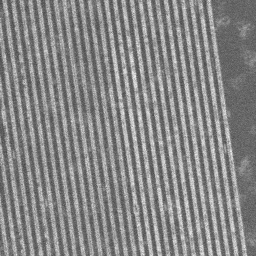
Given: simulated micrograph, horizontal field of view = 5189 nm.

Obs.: parallel lines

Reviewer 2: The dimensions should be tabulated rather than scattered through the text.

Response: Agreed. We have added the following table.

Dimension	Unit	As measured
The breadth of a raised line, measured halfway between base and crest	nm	62.7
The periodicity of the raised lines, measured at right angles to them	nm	170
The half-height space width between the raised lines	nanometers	110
